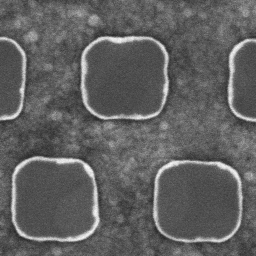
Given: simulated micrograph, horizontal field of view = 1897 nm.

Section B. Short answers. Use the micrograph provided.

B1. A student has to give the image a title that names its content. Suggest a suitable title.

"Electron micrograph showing raised bodies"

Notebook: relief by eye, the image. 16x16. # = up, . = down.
................
................
#.....####......
#....#####....##
##...#####....##
#....#####....##
#....#####....##
................
................
................
.#####....####..
.#####....#####.
.#####....#####.
.#####....#####.
.#####....#####.
................